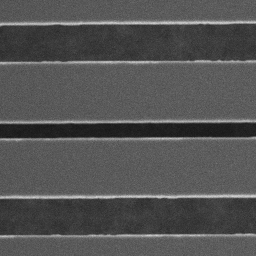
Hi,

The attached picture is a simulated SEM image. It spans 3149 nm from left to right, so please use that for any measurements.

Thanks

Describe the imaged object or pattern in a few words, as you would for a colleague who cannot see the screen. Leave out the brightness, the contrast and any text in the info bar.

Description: lines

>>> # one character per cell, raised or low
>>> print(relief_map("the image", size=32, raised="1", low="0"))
11111111111111111111111111111111
11111111111111111111111111111111
11111111111111111111111111111111
00000000000000000000000000000000
00000000000000000000000000000000
00000000000000000000000000000000
00000000000000000000000000000000
00000000000000000000000000000000
11111111111111111111111111111111
11111111111111111111111111111111
11111111111111111111111111111111
11111111111111111111111111111111
11111111111111111111111111111111
11111111111111111111111111111111
11111111111111111111111111111111
00000000000000000000000000000000
00000000000000000000000000000000
11111111111111111111111111111111
11111111111111111111111111111111
11111111111111111111111111111111
11111111111111111111111111111111
11111111111111111111111111111111
11111111111111111111111111111111
11111111111111111111111111111111
11111111111111111111111111111111
00000000000000000000000000000000
00000000000000000000000000000000
00000000000000000000000000000000
00000000000000000000000000000000
11111111111111111111111111111111
11111111111111111111111111111111
11111111111111111111111111111111